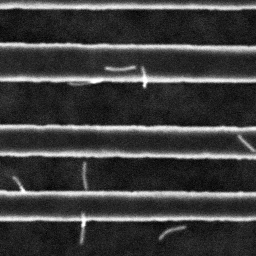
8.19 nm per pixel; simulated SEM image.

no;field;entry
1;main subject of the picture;lines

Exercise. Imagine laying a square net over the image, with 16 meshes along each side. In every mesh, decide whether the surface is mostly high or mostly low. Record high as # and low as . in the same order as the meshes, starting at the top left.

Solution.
.....#.....#####
................
................
################
################
................
................
................
################
################
................
................
################
################
................
................